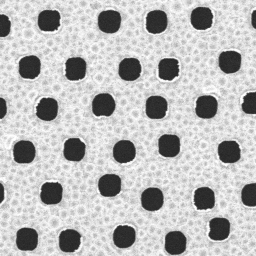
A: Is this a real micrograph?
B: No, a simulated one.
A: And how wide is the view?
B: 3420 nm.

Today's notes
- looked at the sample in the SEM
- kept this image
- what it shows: a regular array of holes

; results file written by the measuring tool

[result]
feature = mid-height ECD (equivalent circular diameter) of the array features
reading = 319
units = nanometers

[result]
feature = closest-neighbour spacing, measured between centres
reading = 0.604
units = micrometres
